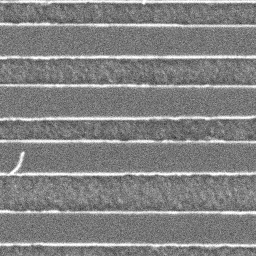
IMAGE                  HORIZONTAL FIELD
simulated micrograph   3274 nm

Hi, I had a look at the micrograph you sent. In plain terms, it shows lines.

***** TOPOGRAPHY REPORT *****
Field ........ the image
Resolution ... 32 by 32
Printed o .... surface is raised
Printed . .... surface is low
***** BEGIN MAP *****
................................
................................
................................
oooooooooooooooooooooooooooooooo
oooooooooooooooooooooooooooooooo
oooooooooooooooooooooooooooooooo
oooooooooooooooooooooooooooooooo
................................
................................
................................
................................
oooooooooooooooooooooooooooooooo
oooooooooooooooooooooooooooooooo
oooooooooooooooooooooooooooooooo
oooooooooooooooooooooooooooooooo
................................
................................
................................
oooooooooooooooooooooooooooooooo
oooooooooooooooooooooooooooooooo
oooooooooooooooooooooooooooooooo
oooooooooooooooooooooooooooooooo
................................
................................
................................
................................
oo....o.........................
oooooooooooooooooooooooooooooooo
oooooooooooooooooooooooooooooooo
oooooooooooooooooooooooooooooooo
oooooooooooooooooooooooooooooooo
................................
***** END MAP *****